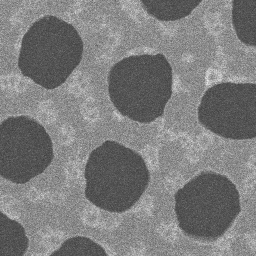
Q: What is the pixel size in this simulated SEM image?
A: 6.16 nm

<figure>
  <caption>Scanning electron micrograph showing holes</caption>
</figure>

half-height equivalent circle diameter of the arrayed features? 414 nm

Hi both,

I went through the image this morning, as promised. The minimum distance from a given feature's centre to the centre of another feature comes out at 586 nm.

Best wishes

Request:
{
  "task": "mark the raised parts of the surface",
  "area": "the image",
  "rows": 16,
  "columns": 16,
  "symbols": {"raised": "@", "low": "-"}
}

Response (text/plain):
@@@@@@@@@---@@@-
@@--@@@@@@@@@@@-
@----@@@@@@@@@@-
@----@@@--@@@@@@
@----@@----@@@@@
@@@@@@@----@@---
@@@@@@@---@@@---
--@@@@@@--@@----
---@@@@@@@@@@@--
---@@@--@@@@@@@@
---@@----@@@@@@@
@@@@@----@@@---@
@@@@@@---@@----@
@@@@@@@@@@@----@
--@@@@@@@@@---@@
--@@--@@@@@@@@@@